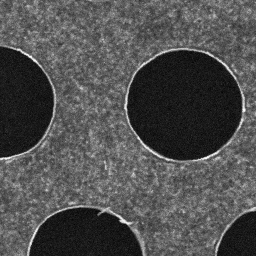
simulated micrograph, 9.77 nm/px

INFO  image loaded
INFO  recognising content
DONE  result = holes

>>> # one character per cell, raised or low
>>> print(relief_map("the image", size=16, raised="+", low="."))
++++++++++++++++
++++++++++++++++
++++++++++++++++
..++++++++...+++
...++++++.....++
...+++++.......+
...+++++.......+
...+++++.......+
...++++++......+
..++++++++...+++
++++++++++++++++
++++++++++++++++
++++++++++++++++
+++....++++++++.
++......++++++..
++.......+++++..